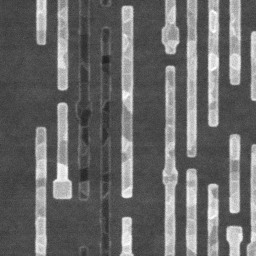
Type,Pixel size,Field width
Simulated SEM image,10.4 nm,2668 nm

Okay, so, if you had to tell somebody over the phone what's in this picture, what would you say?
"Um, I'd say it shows wiring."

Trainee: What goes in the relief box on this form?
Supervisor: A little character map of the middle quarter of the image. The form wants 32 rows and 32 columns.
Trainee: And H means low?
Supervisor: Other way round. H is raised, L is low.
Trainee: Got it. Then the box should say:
HLLLHHLLLHHHLLLHHLLLLLLLLLLLLLLH
HLLLHHLLLHHHLLLHHLLLLLLLLLHHLLLH
HLLLHHLLLHHHLLLHHLLLLLLLLLHHLLLH
HLLLHHLLLHHHLLLHHLLLLLLLLLHHLLLH
HLLLHHLLLHHHLLLHHLLLLLLLLLHHLLLH
HLLLHHLLLHHHLLLHHLLLLLLLLLHHLLLH
LLLLHHLLLHHHLLLHHLLLLLLLLLHHLLLH
LLLLHHLLLHHHLLLHHLLLLLLLLLHHLLLH
LLLLHHLLLHHLLLLHHLLLLLLLLLHHLLLH
LLLHHHHLLHHLLLLHHLLLLLLLLLHHLLLH
HLLHHHHLLHHHLLLHHLLLLLLLLLHHLLLH
HLLHHHHLLHHHLLLHHLLLLLLLLLHHLLLH
HLLHHHHLLHHHLLLHHLLLLLLLLLHHLLLH
HLLLHHHLLHHHLLLHHLLLLLLLLLHHLLLH
HLLLHHLLLHHHLLLHHLLLLLLLLLHHLLLH
HLLLHHLLLHHLLLLHHLLLLLLLLLHHLLLH
HLLLHHLLLHHLLLLHHLLLLLLLLLHHLLLH
HLLLHHLLLHHLLLLHHLLLLLLLLLHHLLLH
HLLLHHLLLHHLLLLHHLLLLLLLLLHHLLLH
HLLLHHLLLHHLLLLHHLLLLLLLLLHHLLLH
HLLLHHLLLHHLLLLHHLLLLLLLLLHHLLLH
HLLLHHLLLHHLLLLHHLLLLLLLLLHLLLLH
HLLLHHLLLHHLLLLHHLLLLLLLLLHHLLLH
HLLLHHLLLHHLLLLHHLLLLLLLLLHHLLLL
HLLLHHLLLHHLLLLHHLLLLLLLLHHHLLLL
HLLLHHLLLHHLLLLHHLLLLLLLLHHHLLLL
HLLLHHLLLHHLLLLHHLLLLLLLLHHHLLLH
HLLLHHLLLHHLLLLHHLLLLLLLLHHHLLLH
HLLLHHLLLHHLLLLHHLLLLLLLLHHHLLLH
HHLLHHLLLHHLLLLHHLLLLLLLLHHHLLLH
HHLLHHLLLHHLLLLHHLLLLLLLLHHHLLLH
HHLLHHLLLHHLLLLHHLLLLLLLLLHHLLLH